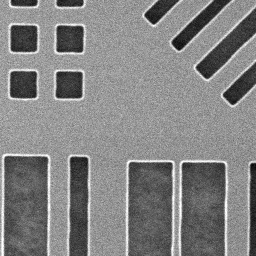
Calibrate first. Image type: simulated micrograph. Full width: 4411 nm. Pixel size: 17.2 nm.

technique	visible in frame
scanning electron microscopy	groups of lines, slits or small figures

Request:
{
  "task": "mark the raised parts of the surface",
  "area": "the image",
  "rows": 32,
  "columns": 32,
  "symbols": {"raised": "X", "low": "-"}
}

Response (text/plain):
X----XX---XXXXXXXXX---XXXX---XXX
XXXXXXXXXXXXXXXXXX---XXXX---XXX-
XXXXXXXXXXXXXXXXXX--XXXX---XXX--
X----XX---XXXXXXXXXXXXX--XXXX---
X----XX----XXXXXXXXXXX--XXXX----
X----XX----XXXXXXXXXXX-XXXX----X
XX--XXX---XXXXXXXXXXXXXXXX----XX
XXXXXXXXXXXXXXXXXXXXXXXXX----XXX
XXXXXXXXXXXXXXXXXXXXXXXXX---XXX-
X----XX---XXXXXXXXXXXXXXX--XXX--
X----XX---XXXXXXXXXXXXXXXXXXX---
X----XX---XXXXXXXXXXXXXXXXXX---X
XXXXXXXXXXXXXXXXXXXXXXXXXXXX--XX
XXXXXXXXXXXXXXXXXXXXXXXXXXXXXXXX
XXXXXXXXXXXXXXXXXXXXXXXXXXXXXXXX
XXXXXXXXXXXXXXXXXXXXXXXXXXXXXXXX
XXXXXXXXXXXXXXXXXXXXXXXXXXXXXXXX
XXXXXXXXXXXXXXXXXXXXXXXXXXXXXXXX
XXXXXXXXXXXXXXXXXXXXXXXXXXXXXXXX
X-----XXX-XXXXXXXXXXXXXXXXXXXXXX
------XXX--XXXXX-----XX-----XXXX
------XXX--XXXXX------X-----XXX-
------XXX--XXXXX------X-----XXX-
------XXX--XXXXX------X-----XXX-
------XXX--XXXXX------X-----XXX-
------XXX--XXXXX------X-----XXX-
------XXX--XXXXX------X-----XXX-
------XXX--XXXXX------X-----XXX-
------XXX--XXXXX------------XXX-
------XXX--XXXXX------------XXX-
------XX---XXXXX------------XXX-
------XX---XXXXX------------XXX-